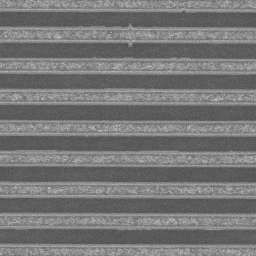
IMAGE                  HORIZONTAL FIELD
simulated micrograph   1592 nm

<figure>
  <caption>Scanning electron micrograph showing parallel lines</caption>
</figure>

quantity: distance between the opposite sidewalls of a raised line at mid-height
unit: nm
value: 84.7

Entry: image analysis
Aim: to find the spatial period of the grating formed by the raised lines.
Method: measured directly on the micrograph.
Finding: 193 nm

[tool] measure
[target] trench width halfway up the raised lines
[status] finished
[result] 109 nanometers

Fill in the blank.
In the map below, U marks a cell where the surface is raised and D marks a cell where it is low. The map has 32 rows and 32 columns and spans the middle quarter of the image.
UUUUUUUUUUUUUUUUUUUUUUUUUUUUUUUU
UUUUUUUUUUUUUUUUUUUUUUUUUUUUUUUU
DDDDDDDDDDDDDDDDDDDDDDDDDDDDDDDD
DDDDDDDDDDDDDDDDDDDDDDDDDDDDDDDD
DDDDDDDDDDDDDDDDDDDDDDDDDDDDDDDD
DDDDDDDDDDDDDDDDDDDDDDDDDDDDDDDD
DDDDDDDDDDDDDDDDDDDDDDDDDDDDDDDD
UUUUUUUUUUUUUUUUUUUUUUUUUUUUUUUU
UUUUUUUUUUUUUUUUUUUUUUUUUUUUUUUU
UUUUUUUUUUUUUUUUUUUUUUUUUUUUUUUU
DDDDDDDDDDDDDDDDDDDDDDDDDDDDDDDD
DDDDDDDDDDDDDDDDDDDDDDDDDDDDDDDD
DDDDDDDDDDDDDDDDDDDDDDDDDDDDDDDD
DDDDDDDDDDDDDDDDDDDDDDDDDDDDDDDD
UUUUUUUUUUUUUUUUUUUUUUUUUUUDDDDD
UUUUUUUUUUUUUUUUUUUUUUUUUUUUUUUU
UUUUUUUUUUUUUUUUUUUUUUUUUUUUUUUU
UUUUUUUUUUUUUUUUUUUUUUUUUUUUUUUU
DDDDDDDDDDDDDDDDDDDDDDDDDDDDDDDD
DDDDDDDDDDDDDDDDDDDDDDDDDDDDDDDD
DDDDDDDDDDDDDDDDDDDDDDDDDDDDDDDD
DDDDDDDDDDDDDDDDDDDDDDDDDDDDDDDD
UUUUUUUUUUUUUUUUUUUUUUUUUUUUUUUU
UUUUUUUUUUUUUUUUUUUUUUUUUUUUUUUU
UUUUUUUUUUUUUUUUUUUUUUUUUUUUUUUU
DDDDDDDDDDDDDDDDDDDDDDDDDDDDDDDD
DDDDDDDDDDDDDDDDDDDDDDDDDDDDDDDD
DDDDDDDDDDDDDDDDDDDDDDDDDDDDDDDD
DDDDDDDDDDDDDDDDDDDDDDDDDDDDDDDD
DDDDDDDDDDDDDDDDDDDDDDDDDDDDDDDD
UUUUUUUUUUUUUUUUUUUUUUUUUUUUUUUU
UUUUUUUUUUUUUUUUUUUUUUUUUUUUUUUU